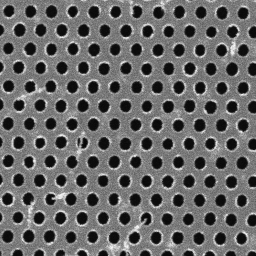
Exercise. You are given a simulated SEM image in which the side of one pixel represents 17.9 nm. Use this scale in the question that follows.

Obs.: a regular array of holes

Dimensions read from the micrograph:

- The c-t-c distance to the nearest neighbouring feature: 376 nanometres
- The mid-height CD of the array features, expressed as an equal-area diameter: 217 nanometres